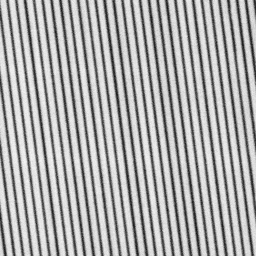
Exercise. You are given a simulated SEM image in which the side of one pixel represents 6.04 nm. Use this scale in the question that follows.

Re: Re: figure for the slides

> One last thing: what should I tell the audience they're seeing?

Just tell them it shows parallel lines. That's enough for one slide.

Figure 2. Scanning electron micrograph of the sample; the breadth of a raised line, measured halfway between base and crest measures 30.7 nm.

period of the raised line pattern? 52.9 nm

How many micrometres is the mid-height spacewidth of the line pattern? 0.0202